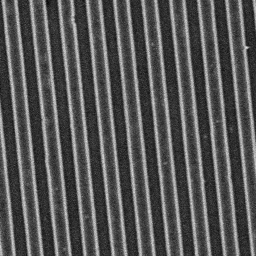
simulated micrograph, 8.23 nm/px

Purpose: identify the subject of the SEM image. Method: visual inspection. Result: parallel lines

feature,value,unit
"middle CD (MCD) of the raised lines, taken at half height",118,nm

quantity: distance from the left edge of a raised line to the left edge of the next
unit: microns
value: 0.229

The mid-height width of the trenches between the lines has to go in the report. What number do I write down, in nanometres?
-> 112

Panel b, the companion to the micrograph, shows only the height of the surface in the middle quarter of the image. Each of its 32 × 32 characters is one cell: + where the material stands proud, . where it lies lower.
++++...++++...++++...++++...++++
.+++....+++...++++...++++...++++
.+++....+++...++++...++++...++++
.+++....+++....+++....+++....+++
.+++....+++....+++....+++....+++
.+++....+++....+++....+++....+++
.+++....+++....+++....+++....+++
.+++....+++....+++....+++....+++
.++++...++++...++++...++++...+++
.++++...++++...++++...++++...+++
..+++...++++...++++...++++...+++
..+++...++++...++++...++++...+++
..+++...++++....+++....+++....++
..+++....+++....+++....+++....++
..+++....+++....+++....+++....++
..+++....+++....+++....+++....++
..+++....+++....+++....+++....++
..+++....+++....+++....+++....++
..++++...++++...++++...++++...++
..++++...++++...++++...++++...++
...+++...++++...++++...++++...++
...+++...++++...++++...++++...++
...+++....+++....+++....+++....+
...+++....+++....+++....+++....+
...+++....+++....+++....+++....+
...+++....+++....+++....+++....+
...+++....+++....+++....+++....+
...+++....+++....+++....+++....+
...++++...++++...++++...++++...+
...++++...++++...++++...++++...+
...++++...++++...++++...++++...+
...++++...++++...++++...++++...+